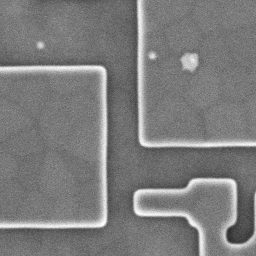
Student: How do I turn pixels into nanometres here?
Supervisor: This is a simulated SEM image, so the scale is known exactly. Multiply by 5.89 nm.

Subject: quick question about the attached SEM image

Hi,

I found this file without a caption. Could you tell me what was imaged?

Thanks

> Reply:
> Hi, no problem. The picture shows wiring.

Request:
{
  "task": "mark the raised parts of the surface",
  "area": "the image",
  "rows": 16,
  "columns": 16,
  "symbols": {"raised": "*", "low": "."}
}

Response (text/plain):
.........*******
.........*******
.........*******
.........*******
******...*******
*******..*******
*******..*******
*******..*******
*******..*******
*******.........
*******.........
*******.....***.
*******.*******.
*******....****.
............**..
.............***